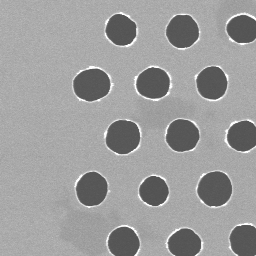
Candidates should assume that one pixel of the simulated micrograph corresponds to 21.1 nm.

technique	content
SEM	a regular array of holes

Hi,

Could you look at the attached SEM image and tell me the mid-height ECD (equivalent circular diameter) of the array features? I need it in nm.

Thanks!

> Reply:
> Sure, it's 700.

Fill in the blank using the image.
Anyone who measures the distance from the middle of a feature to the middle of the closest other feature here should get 1270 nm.